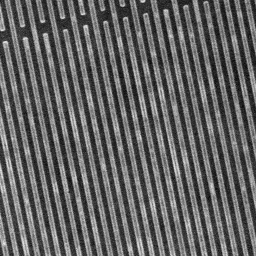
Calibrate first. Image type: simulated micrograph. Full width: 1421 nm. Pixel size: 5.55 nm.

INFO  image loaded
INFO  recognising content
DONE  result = parallel lines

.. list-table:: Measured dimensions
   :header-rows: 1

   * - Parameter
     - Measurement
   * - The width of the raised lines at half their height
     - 4.67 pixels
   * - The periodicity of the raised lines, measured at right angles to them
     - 56.8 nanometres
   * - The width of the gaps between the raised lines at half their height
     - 32.7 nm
